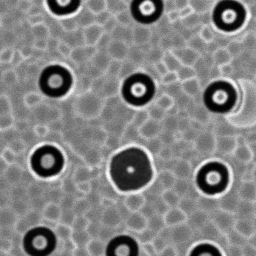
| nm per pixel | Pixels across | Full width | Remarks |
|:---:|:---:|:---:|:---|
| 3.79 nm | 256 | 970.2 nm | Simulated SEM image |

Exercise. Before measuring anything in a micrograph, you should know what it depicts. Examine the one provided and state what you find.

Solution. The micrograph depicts ring-shaped grooves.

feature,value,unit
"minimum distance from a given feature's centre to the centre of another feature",308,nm